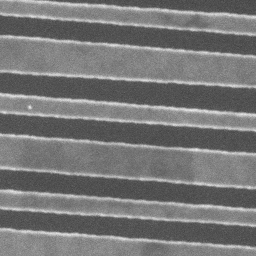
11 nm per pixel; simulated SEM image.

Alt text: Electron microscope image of lines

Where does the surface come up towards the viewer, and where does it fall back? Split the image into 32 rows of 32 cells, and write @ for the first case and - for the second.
@@@@@@@@@-----------------------
@@@@@@@@@@@@@@@@@@@@@@@---------
---------@@@@@@@@@@@@@@@@@@@@@@@
---------------------@@@@@@@@@@@
--------------------------------
@@@@@@@@@@@@@@------------------
@@@@@@@@@@@@@@@@@@@@@@@@@-------
@@@@@@@@@@@@@@@@@@@@@@@@@@@@@@@@
@@@@@@@@@@@@@@@@@@@@@@@@@@@@@@@@
--------@@@@@@@@@@@@@@@@@@@@@@@@
-------------------------@@@@@@@
--------------------------------
@@@@@@@@@-----------------------
@@@@@@@@@@@@@@@@@@@@@@----------
------@@@@@@@@@@@@@@@@@@@@@@@@@@
--------------------@@@@@@@@@@@@
--------------------------------
@@@@@@@@@@----------------------
@@@@@@@@@@@@@@@@@@@@@-----------
@@@@@@@@@@@@@@@@@@@@@@@@@@@@@@@@
@@@@@@@@@@@@@@@@@@@@@@@@@@@@@@@@
------@@@@@@@@@@@@@@@@@@@@@@@@@@
-------------------@@@@@@@@@@@@@
-------------------------------@
@@@@@@@@@-----------------------
@@@@@@@@@@@@@@@@@@@@@@@---------
------@@@@@@@@@@@@@@@@@@@@@@@@@@
--------------------@@@@@@@@@@@@
--------------------------------
@@@@@@@@@@@@--------------------
@@@@@@@@@@@@@@@@@@@@@@@@@-------
@@@@@@@@@@@@@@@@@@@@@@@@@@@@@@@@